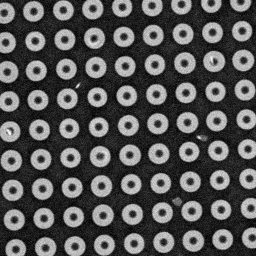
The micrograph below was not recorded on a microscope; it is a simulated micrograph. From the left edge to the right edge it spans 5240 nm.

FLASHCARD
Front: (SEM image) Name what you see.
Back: an array of small figures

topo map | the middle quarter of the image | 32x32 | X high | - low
XXX---XXXX---XXXXX--XXXXX---XXXX
XXX---XXXX---XXXXX---XXXX---XXXX
XXX---XXXX----XXX-----XX--------
XX------------------------------
--------------------------------
----------------------XX-----XXX
XX-----XXX----XXXX---XXXX---XXXX
XXX---XXXXX--XXXXX---XXXXX--XXXX
XXX---XXXXX--XXXXX---XXXX---XXXX
XXX---XXXX----XXXX---XXXX-----X-
XXX-----X-----------------------
--------------------------------
-----------------------X-----XXX
--------------XXXX---XXXXX---XXX
XXX----XXXX---XXXX---XXXXX--XXXX
XXXX--XXXXX---XXXXX--XXXXX--XXXX
XXXX--XXXXX---XXXX---XXXXX---XXX
XXX----XXX-----XX---------------
--------------------------------
--------------------------------
---------------XXX----XXX----XXX
XXX----XXXX---XXXXX--XXXXX---XXX
XXXX---XXXX---XXXXX--XXXXX---XXX
XXXX---XXXX---XXXXX--XXXXX---XXX
XXXX---XXXX----XXXX---XXX-------
XXX-----XX----------------------
--------------------------------
-----------------------XX-----XX
--------XXX----XXXX---XXXX---XXX
XXXX---XXXXX--XXXXX---XXXXX--XXX
XXXX---XXXXX--XXXXX---XXXXX--XXX
XXXX---XXXXX---XXXX---XXXX----XX